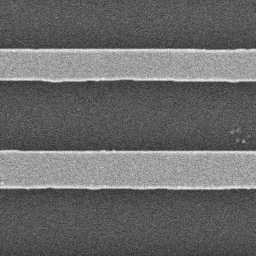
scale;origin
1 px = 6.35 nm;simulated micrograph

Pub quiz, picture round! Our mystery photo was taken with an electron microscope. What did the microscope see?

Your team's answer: lines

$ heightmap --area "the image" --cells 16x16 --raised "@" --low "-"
----------------
----------------
----------------
@@@@@@@@@@@@@@@@
@@@@@@@@@@@@@@@@
----------------
----------------
----------------
----------------
@@@@@@@@@@@@@@@@
@@@@@@@@@@@@@@@@
@@@@@@@@@@@@@@@@
----------------
----------------
----------------
----------------